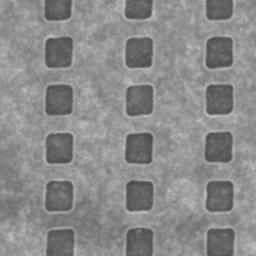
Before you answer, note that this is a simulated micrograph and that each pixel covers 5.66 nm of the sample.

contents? a regular array of holes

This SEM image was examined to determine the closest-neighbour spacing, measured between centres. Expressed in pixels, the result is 47.8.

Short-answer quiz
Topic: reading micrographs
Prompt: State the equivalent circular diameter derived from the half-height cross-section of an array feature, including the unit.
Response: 186 nm